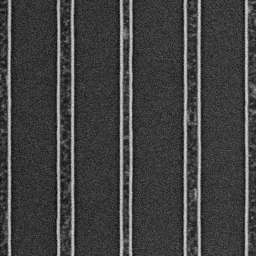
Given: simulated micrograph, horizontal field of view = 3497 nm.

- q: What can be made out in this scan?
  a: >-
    one or a few lines or trenches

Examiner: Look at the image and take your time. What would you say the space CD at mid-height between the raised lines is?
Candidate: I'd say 661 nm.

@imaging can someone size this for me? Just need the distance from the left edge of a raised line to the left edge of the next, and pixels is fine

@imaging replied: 63.5